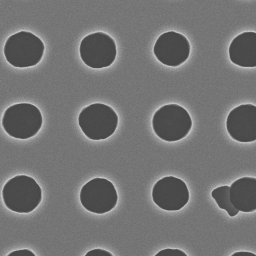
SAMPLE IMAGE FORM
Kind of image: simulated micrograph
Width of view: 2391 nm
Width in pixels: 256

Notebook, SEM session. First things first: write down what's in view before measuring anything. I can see a regular array of holes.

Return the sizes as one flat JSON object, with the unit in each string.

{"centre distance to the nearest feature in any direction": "664 nanometres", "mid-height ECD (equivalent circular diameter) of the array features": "346 nm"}